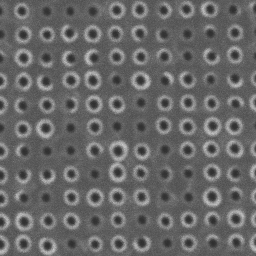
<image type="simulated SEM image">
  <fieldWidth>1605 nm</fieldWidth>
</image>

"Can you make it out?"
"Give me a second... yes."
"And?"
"a regular array of holes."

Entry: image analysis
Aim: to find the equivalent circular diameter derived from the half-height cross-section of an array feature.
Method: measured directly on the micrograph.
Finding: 0.0557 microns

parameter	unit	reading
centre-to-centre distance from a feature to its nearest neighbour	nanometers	142